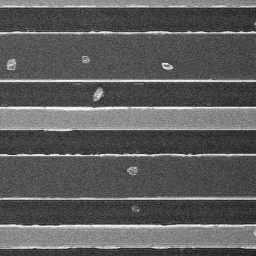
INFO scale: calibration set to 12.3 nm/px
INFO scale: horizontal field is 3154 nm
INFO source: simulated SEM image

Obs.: lines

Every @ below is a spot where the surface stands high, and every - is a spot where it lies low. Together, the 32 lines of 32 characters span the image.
@@@@@@@@@@@@@@@@@@@@@@@@@@@@@@@@
--------------------------------
--------------------------------
--------------------------------
@@@@@@@@@@@@@@@@@@@@@@@@@@@@@@@@
@@@@@@@@@@@@@@@@@@@@@@@@@@@@@@@@
@@@@@@@@@@@@@@@@@@@@@@@@@@@@@@@@
@@@@@@@@@@@@@@@@@@@@@@@@@@@@@@@@
@@@@@@@@@@@@@@@@@@@@@@@@@@@@@@@@
@@@@@@@@@@@@@@@@@@@@@@@@@@@@@@@@
--------------------------------
--------------------------------
--------------------------------
@---------------@-@@----@@@@@@@@
@@@@@@@@@@@@@@@@@@@@@@@@@@@@@@@@
@@@@@@@@@@@@@@@@@@@@@@@@@@@@@@@@
--------------------------------
--------------------------------
--------------------------------
@@@@@@@@@@@@@@@@@@@@@@@@@@@@@@@@
@@@@@@@@@@@@@@@@@@@@@@@@@@@@@@@@
@@@@@@@@@@@@@@@@@@@@@@@@@@@@@@@@
@@@@@@@@@@@@@@@@@@@@@@@@@@@@@@@@
@@@@@@@@@@@@@@@@@@@@@@@@@@@@@@@@
@@@@@@@@@@@@@@@@@@@@@@@@@@@@@@@@
--------------------------------
--------------------------------
--------------------------------
@@@@@@@@@@@@@@@@@@@@@@@@@@@@@@@@
@@@@@@@@@@@@@@@@@@@@@@@@@@@@@@@@
@@@@@@@@@@@@@@@@@@@@@@@@@@@@@@@@
--------------------------------